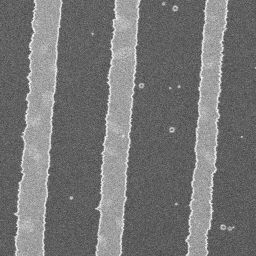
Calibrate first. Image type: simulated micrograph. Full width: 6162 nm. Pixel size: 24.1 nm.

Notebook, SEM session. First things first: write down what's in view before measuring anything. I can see one or a few lines or trenches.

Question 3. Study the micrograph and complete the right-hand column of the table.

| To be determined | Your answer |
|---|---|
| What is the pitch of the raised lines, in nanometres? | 2020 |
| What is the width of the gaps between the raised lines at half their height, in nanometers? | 1380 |